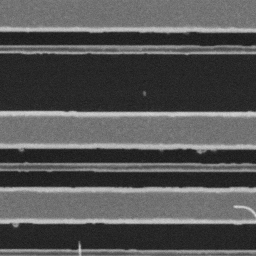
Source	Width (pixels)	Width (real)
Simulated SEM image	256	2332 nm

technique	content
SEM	lines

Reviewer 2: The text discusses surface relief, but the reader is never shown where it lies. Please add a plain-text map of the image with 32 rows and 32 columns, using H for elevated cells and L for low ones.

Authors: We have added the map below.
HHHHHHHHHHHHHHHHHHHHHHHHHHHHHHHH
HHHHHHHHHHHHHHHHHHHHHHHHHHHHHHHH
HHHHHHHHHHHHHHHHHHHHHHHHHHHHHHHH
HHHHHHHHHHHHHHHHHHHHHHHHHHHHHHHH
LLLLLLLLLLLLLLLLLLLLLLLLLLLLLLLL
LLLLLLLLLLLLLLLLLLLLLLLLLLLLLLLL
LLLLLLLLHHHLLHHLLLLLLHHHHHLLHHHH
LLLLLLLLLLLLLLLLLLLLLLLLLLLLLLLL
LLLLLLLLLLLLLLLLLLLLLLLLLLLLLLLL
LLLLLLLLLLLLLLLLLLLLLLLLLLLLLLLL
LLLLLLLLLLLLLLLLLLLLLLLLLLLLLLLL
LLLLLLLLLLLLLLLLLLLLLLLLLLLLLLLL
LLLLLLLLLLLLLLLLLLLLLLLLLLLLLLLL
LLLLLLLLLLLLLLLLLLLLLLLLLLLLLLLL
HHHHHHHHHHHHHHHHHHHHHHHHHHHHHHHH
HHHHHHHHHHHHHHHHHHHHHHHHHHHHHHHH
HHHHHHHHHHHHHHHHHHHHHHHHHHHHHHHH
HHHHHHHHHHHHHHHHHHHHHHHHHHHHHHHH
LLLLLLLLLLLLLLLLLLLLLLLLHHHHHHHH
LLLLLLLLLLLLLLLLLLLLLLLLLLLLLLLL
LLLLLLLLLLLLLLLLLLLLLLLLLLLLLLLL
LLLLLLLLLLLLLLLLLLLLLLLLLLLLLLLL
LLLLLLLLLLLLLLLLLLLLLLLLLLLLLLLL
LLLLLLLLLLLLLLLLLLLLLLLLLLLLLLLL
HHHHHHHHHHHHHHHHHHHHHHHHHHHHHHHH
HHHHHHHHHHHHHHHHHHHHHHHHHHHHHHHH
HHHHHHHHHHHHHHHHHHHHHHHHHHHHHHHH
HHHHHHHHHHHHHHHHHHHHHHHHHHHHHHHH
LLLLLLLLLLLLLLLLLLLLLLLLLLLLLLLL
LLLLLLLLLLLLLLLLLLLLLLLLLLLLLLLL
LLLLLLLLLLLLLLLLLLLLLLLLLLLLLLLL
HHHHHHHHHHHHHHHHHLLLLLLLLLLLLLLL